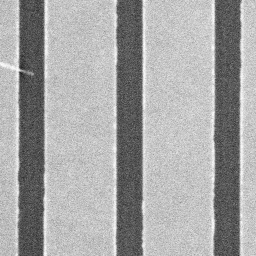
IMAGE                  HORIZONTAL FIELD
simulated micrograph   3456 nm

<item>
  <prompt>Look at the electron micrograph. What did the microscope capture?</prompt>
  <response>lines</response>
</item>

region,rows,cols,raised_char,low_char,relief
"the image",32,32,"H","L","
HHLLLLHHHHHHHHHLLLHHHHHHHHHLLLHH
HHLLLLHHHHHHHHLLLLHHHHHHHHHLLLHH
HHLLLLHHHHHHHHHLLLHHHHHHHHHLLLHH
HHLLLLHHHHHHHHLLLLHHHHHHHHHLLLHH
HHLLLLHHHHHHHHLLLLHHHHHHHHHLLLHH
HHLLLLHHHHHHHHLLLLHHHHHHHHHLLLHH
HHLLLLHHHHHHHHHLLLHHHHHHHHHLLLHH
HHLLLLHHHHHHHHHLLLHHHHHHHHHLLLHH
HHLLLLHHHHHHHHLLLLHHHHHHHHHLLLHH
HHLLLLHHHHHHHHLLLLHHHHHHHHHLLLHH
HHLLLLHHHHHHHHLLLLHHHHHHHHHLLLHH
HHLLLLHHHHHHHHLLLLHHHHHHHHHLLLHH
HHLLLLHHHHHHHHLLLLHHHHHHHHHLLLHH
HHLLLLHHHHHHHHLLLLHHHHHHHHHLLLHH
HHLLLLHHHHHHHHLLLLHHHHHHHHHLLLHH
HHLLLLHHHHHHHHLLLLHHHHHHHHHLLLHH
HHLLLLHHHHHHHHLLLLHHHHHHHHHLLLHH
HHLLLLHHHHHHHHLLLLHHHHHHHHHLLLHH
HHLLLLHHHHHHHHLLLLHHHHHHHHHLLLHH
HHLLLLHHHHHHHHLLLLHHHHHHHHHLLLHH
HHLLLLHHHHHHHHLLLLHHHHHHHHHLLLHH
HHLLLLHHHHHHHHLLLLHHHHHHHHHLLLHH
HHLLLLHHHHHHHHLLLLHHHHHHHHHLLLHH
HHLLLLHHHHHHHHLLLLHHHHHHHHHLLLHH
HHLLLLHHHHHHHHLLLLHHHHHHHHHLLLHH
HHLLLLHHHHHHHHLLLLHHHHHHHHHLLLHH
HHLLLLHHHHHHHHLLLLHHHHHHHHHLLLHH
HHLLLLHHHHHHHHLLLLHHHHHHHHHLLLHH
HHLLLLHHHHHHHHLLLLHHHHHHHHHLLLHH
HHLLLLHHHHHHHHLLLLHHHHHHHHHLLLHH
HHLLLLHHHHHHHHLLLLHHHHHHHHHLLLHH
HHLLLLHHHHHHHHLLLLHHHHHHHHHLLLHH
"